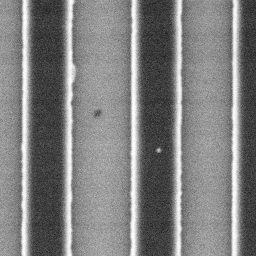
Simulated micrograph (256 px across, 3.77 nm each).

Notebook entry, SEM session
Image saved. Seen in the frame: lines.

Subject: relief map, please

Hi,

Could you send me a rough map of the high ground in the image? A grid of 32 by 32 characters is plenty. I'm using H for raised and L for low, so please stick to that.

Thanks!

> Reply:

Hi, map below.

LLLHHHHHHLLLLLLLLHHHHHHLLLLLLHHH
LLLHHHHHHLLLLLLLLHHHHHHLLLLLLHHH
LLLHHHHHHLLLLLLLLHHHHHHLLLLLLHHH
LLLHHHHHHLLLLLLLLHHHHHHLLLLLLHHH
LLLHHHHHHLLLLLLLLHHHHHHLLLLLLHHH
LLLHHHHHHLLLLLLLLHHHHHHLLLLLLHHH
LLLHHHHHHLLLLLLLLHHHHHHLLLLLLHHH
LLLHHHHHHLLLLLLLLHHHHHHLLLLLLHHH
LLLHHHHHHLLLLLLLLHHHHHHLLLLLLHHH
LLLHHHHHHLLLLLLLLHHHHHHLLLLLLHHH
LLLHHHHHHLLLLLLLLHHHHHHLLLLLLHHH
LLLHHHHHHLLLLLLLLHHHHHHLLLLLLHHH
LLLHHHHHHLLLLLLLLHHHHHHLLLLLLHHH
LLLHHHHHHLLLLLLLLHHHHHHLLLLLLHHH
LLLHHHHHHLLLLLLLLHHHHHHLLLLLLHHH
LLLHHHHHHLLLLLLLLHHHHHHLLLLLLHHH
LLLHHHHHHLLLLLLLLHHHHHLLLLLLLHHH
LLLHHHHHHLLLLLLLLHHHHHLLLLLLLHHH
LLLHHHHHHLLLLLLLLHHHHHLLLLLLLHHH
LLLHHHHHHLLLLLLLLHHHHHHLLLLLLHHH
LLLHHHHHHLLLLLLLLHHHHHLLLLLLLHHH
LLLHHHHHHLLLLLLLLHHHHHHLLLLLLHHH
LLLHHHHHHLLLLLLLLHHHHHLLLLLLLHHH
LLLHHHHHHLLLLLLLLHHHHHHLLLLLLHHH
LLLHHHHHHLLLLLLLHHHHHHLLLLLLLHHH
LLLHHHHHHLLLLLLLLHHHHHLLLLLLLHHH
LLLHHHHHHLLLLLLLLHHHHHLLLLLLLHHH
LLLHHHHHHLLLLLLLHHHHHHLLLLLLLHHH
LLLHHHHHHLLLLLLLHHHHHHHLLLLLLHHH
LLLHHHHHHLLLLLLLHHHHHHLLLLLLLHHH
LLLHHHHHHLLLLLLLLHHHHHLLLLLLLHHH
LLLHHHHHHLLLLLLLHHHHHHLLLLLLLHHH